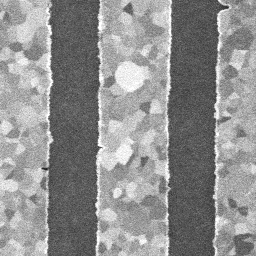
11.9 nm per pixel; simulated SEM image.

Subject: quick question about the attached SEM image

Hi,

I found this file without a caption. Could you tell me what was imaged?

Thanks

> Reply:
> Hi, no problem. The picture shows one or a few lines or trenches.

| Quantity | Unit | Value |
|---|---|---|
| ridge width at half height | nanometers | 839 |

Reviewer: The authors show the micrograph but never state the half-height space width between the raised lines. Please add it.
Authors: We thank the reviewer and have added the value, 585 nm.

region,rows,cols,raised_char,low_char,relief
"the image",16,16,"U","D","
UUUDDDUUUUUDDDUU
UUUDDDUUUUUDDDUU
UUUDDDUUUUUDDDUU
UUUDDDUUUUUDDDUU
UUUDDDUUUUUDDDUU
UUUDDDUUUUUDDDUU
UUUDDDUUUUDDDUUU
UUUDDDUUUUDDDUUU
UUUDDDUUUUUDDUUU
UUUDDDUUUUDDDUUU
UUUDDDUUUUUDDUUU
UUUDDDUUUUUDDUUU
UUUDDDUUUUDDDUUU
UUUDDDUUUUDDDDUU
UUUDDDUUUUDDDUUU
UUUDDDUUUUUDDUUU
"